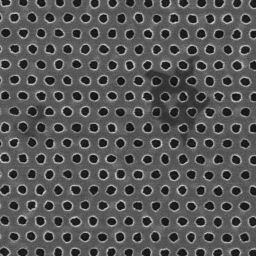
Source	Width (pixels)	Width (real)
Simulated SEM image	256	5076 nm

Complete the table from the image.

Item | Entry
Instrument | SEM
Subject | a regular array of holes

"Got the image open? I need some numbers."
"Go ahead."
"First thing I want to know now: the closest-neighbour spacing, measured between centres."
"17.4 pixels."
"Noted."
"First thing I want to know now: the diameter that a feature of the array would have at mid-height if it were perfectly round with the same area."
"178 nm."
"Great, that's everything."